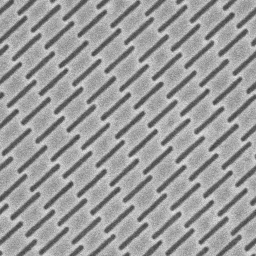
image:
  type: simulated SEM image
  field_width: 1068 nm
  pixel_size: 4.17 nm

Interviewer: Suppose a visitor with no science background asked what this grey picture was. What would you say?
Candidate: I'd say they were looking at a regular array of holes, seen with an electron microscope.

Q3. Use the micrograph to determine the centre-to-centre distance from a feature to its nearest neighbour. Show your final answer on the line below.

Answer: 92.7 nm